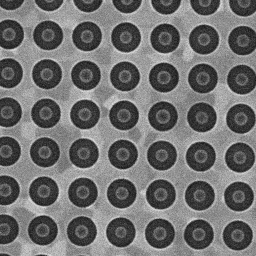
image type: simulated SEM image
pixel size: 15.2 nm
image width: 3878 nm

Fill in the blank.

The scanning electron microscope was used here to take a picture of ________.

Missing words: an array of small figures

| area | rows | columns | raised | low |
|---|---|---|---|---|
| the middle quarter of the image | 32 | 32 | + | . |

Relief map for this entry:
++......++++......++++.....+++++
++...+...+++.......+++......++++
++..+++..++...+++..++...++...++.
++..+++..++...+++..++...++...++.
++.......+++.......++...++...++.
+++.....++++......++++......+++.
++++...++++++....++++++....+++++
++++++++++++++++++++++++++++++++
++++++++++++++++++++++++++++++++
+++.....+++++....+++++++..++++++
++.......+++......++++......++++
++..++...+++..+....++.......+++.
+...+++..++..+++...++..+++..+++.
++..++...++...++...++..+++...++.
++.......+++......+++...++..+++.
+++.....++++......++++......+++.
+++++.++++++++..+++++++...++++++
++++++++++++++++++++++++++++++++
+++++.++++++++++++++++++++++++++
++......++++.....++++++...++++++
++......++++......+++.......+++.
+...++...++...++..+++.......+++.
+...++...++..+++...++..+++..++..
+...++...++..+++..+++..+++..++..
++......+++.......+++.......+++.
+++....+++++.....+++++.....++++.
++++++++++++++.++++++++...++++++
++++++++++++++++++++++++++++++++
++++..++++++++.+++++++++++++++++
++......++++.....+++++....++++++
+.......+++.......+++......++++.
+..+++...++..+++..+++..++...++..